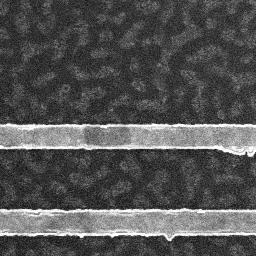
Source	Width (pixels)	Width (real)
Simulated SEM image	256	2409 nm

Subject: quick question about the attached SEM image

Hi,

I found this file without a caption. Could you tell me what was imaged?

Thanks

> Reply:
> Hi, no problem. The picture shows one or a few lines or trenches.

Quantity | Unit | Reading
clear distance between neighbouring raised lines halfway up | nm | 584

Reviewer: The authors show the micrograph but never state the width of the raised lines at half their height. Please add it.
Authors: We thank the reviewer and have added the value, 0.223 micrometres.